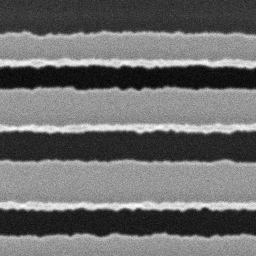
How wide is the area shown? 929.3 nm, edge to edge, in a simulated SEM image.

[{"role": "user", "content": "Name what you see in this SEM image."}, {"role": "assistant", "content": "lines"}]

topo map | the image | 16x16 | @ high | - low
----------------
----------------
@@@@@@@@@@@@@@@@
@@@@@@@@@@@@@@@@
----------------
----------@-----
@@@@@@@@@@@@@@@@
@@@@@@@@@@@@@@@@
----------------
----------------
@@@@@@@@@@@@@@@@
@@@@@@@@@@@@@@@@
@@@@@@@@@@@@@@@@
----------------
----------------
@@@@@@@@@@@@@@@@